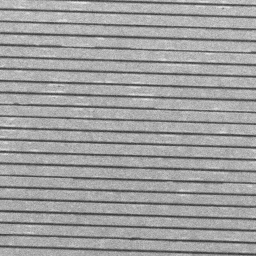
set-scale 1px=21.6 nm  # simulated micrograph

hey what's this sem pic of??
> parallel lines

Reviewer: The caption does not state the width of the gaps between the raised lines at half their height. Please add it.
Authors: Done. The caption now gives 51.3 nm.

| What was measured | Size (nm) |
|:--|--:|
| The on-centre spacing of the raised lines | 256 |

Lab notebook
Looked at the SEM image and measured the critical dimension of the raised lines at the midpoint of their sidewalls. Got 200 nanometers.